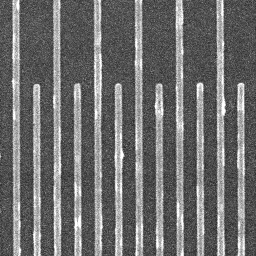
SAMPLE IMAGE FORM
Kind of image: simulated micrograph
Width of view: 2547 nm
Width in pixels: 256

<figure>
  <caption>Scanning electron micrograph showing parallel lines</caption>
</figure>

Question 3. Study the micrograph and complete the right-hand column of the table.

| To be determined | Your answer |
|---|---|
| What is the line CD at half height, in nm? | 59.7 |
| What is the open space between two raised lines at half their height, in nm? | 143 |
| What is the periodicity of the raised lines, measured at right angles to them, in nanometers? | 203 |